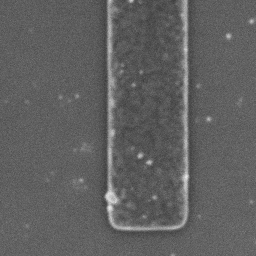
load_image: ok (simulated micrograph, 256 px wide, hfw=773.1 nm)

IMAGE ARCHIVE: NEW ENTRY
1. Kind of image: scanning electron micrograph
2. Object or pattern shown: wiring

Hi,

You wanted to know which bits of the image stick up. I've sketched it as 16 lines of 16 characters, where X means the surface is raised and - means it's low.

-------XXXXX----
-------XXXXX----
-------XXXXX----
-------XXXXX----
-------XXXXX----
-------XXXXX----
-------XXXXX----
-------XXXXX----
-------XXXXX----
-------XXXXX----
-------XXXXX----
-------XXXXX----
-------XXXXX----
-------XXXXX----
----------------
----------------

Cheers